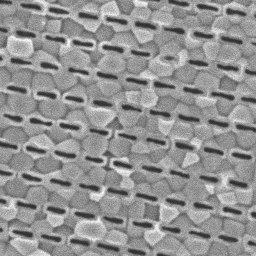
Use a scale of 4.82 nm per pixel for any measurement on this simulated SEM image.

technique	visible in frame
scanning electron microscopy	a regular array of holes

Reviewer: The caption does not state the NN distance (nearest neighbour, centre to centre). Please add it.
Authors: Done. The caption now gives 134 nanometres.